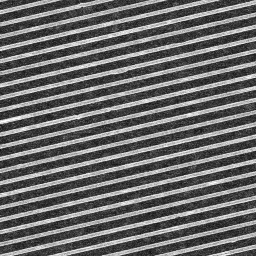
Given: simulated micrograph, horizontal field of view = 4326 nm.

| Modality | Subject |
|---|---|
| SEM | parallel lines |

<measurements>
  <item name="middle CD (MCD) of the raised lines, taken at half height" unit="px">3.41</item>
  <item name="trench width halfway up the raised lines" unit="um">0.14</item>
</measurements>